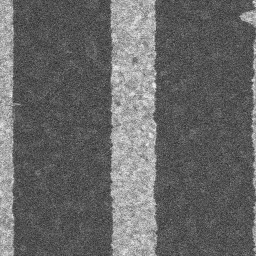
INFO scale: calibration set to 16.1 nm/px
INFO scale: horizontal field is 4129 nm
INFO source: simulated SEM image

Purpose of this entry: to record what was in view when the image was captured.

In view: one or a few lines or trenches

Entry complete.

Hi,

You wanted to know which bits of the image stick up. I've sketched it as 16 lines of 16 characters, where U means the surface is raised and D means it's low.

UDDDDDDUUUDDDDDD
UDDDDDDUUUDDDDDD
UDDDDDDUUUDDDDDD
UDDDDDDUUUDDDDDD
UDDDDDDUUUDDDDDD
UDDDDDDUUUDDDDDD
UDDDDDDUUUDDDDDD
UDDDDDDUUUDDDDDD
UDDDDDDUUUDDDDDD
UDDDDDDUUUDDDDDD
UDDDDDDUUUDDDDDD
UDDDDDDUUUDDDDDD
UDDDDDDUUUDDDDDD
UDDDDDDUUUDDDDDD
UDDDDDDUUUDDDDDD
UDDDDDDUUUDDDDDD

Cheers